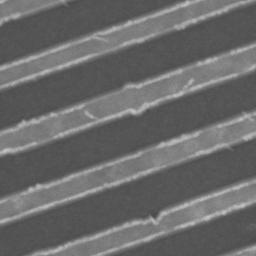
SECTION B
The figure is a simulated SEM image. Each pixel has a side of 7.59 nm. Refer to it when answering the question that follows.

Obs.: parallel lines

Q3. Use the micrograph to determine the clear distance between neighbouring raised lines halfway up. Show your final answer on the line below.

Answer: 292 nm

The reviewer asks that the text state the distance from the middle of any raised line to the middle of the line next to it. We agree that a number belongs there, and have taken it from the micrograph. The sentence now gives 481 nm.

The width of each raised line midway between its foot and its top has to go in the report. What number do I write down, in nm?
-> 190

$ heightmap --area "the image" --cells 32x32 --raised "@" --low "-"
@@@@@@@---------------@@@@@@@@@-
@@@@----------------@@@@@@@@----
@----------------@@@@@@@@-------
--------------@@@@@@@@@---------
-----------@@@@@@@@@------------
--------@@@@@@@@@--------------@
-----@@@@@@@@@--------------@@@@
--@@@@@@@@@---------------@@@@@@
@@@@@@@@---------------@@@@@@@@@
@@@@@---------------@@@@@@@@@@--
@@--------------@@@@@@@@@@@-----
--------------@@@@@@@@@@--------
-----------@@@@@@@@@@-----------
--------@@@@@@@@@@@-------------
-----@@@@@@@@@@---------------@@
--@@@@@@@@@@@--------------@@@@@
@@@@@@@@@@--------------@@@@@@@@
@@@@@@@--------------@@@@@@@@@@-
@@@@--------------@@@@@@@@@@----
----------------@@@@@@@@@-------
-------------@@@@@@@@@----------
----------@@@@@@@@@-------------
-------@@@@@@@@@@--------------@
----@@@@@@@@@@--------------@@@@
-@@@@@@@@@@--------------@@@@@@@
@@@@@@@@---------------@@@@@@@@@
@@@@@---------------@@@@@@@@@---
@@---------------@@@@@@@@@------
--------------@@@@@@@@@---------
-----------@@@@@@@@@------------
--------@@@@@@@@@---------------
----@@@@@@@@@@---------------@@@